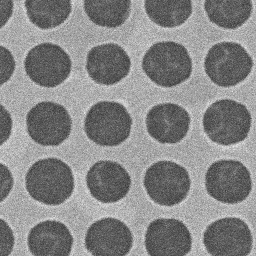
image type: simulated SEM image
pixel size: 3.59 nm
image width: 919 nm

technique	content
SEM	a regular array of holes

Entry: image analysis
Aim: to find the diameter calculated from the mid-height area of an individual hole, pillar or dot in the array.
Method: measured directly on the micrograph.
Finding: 169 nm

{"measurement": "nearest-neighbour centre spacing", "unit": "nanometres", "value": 210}